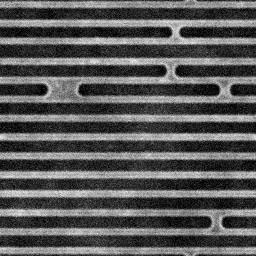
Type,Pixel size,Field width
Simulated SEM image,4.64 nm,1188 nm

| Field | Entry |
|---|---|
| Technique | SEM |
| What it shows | parallel lines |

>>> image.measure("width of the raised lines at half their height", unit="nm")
26.1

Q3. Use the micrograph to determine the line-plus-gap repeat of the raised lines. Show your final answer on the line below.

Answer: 0.088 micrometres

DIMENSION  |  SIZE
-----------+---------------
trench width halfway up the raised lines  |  0.0603 um